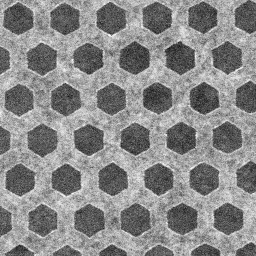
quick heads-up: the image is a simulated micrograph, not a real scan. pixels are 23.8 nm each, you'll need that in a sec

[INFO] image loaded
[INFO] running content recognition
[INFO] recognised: a regular array of raised bodies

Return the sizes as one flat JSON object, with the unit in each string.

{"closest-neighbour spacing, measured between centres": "45.9 px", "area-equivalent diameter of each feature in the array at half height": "760 nm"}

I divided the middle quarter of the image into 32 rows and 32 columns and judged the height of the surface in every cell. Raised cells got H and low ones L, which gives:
LLHHHHHHHHLLLLHHHHHHHLLLLHHHHHHH
LLLLHHHHHLLLLLLHHHHHLLLLLLLHHHHH
LLLLLHHLLLLLLLLLLHHLLLLLLLLLHHLL
LLLLLLLLLLLLLLLLLLLLLLLLLLLLLLLL
LLLLLLLLLLLLLLLLLLLLLLLLLLLLLLLL
HHLLLLLLLLHHHHLLLLLLLHHHHHLLLLLL
HHHLLLLLLHHHHHHLLLLLHHHHHHHLLLLH
HHHHLLLLHHHHHHHHLLLLHHHHHHHLLLLH
HHHHLLLLHHHHHHHHLLLLHHHHHHHLLLLH
HHHHLLLLHHHHHHHHLLLLHHHHHHHLLLLH
HHHHLLLLHHHHHHHHLLLLHHHHHHHLLLLH
HHHHLLLLLHHHHHHLLLLLLHHHHHLLLLLL
HHLLLLLLLLLHHLLLLLLLLLLHLLLLLLLL
LLLLLLLLLLLLLLLLLLLLLLLLLLLLLLLL
LLLLLLLLLLLLLLLLLLLLLLLLLLLLLHLL
LLLLLHHLLLLLLLLLHHHHLLLLLLLHHHHH
LLLHHHHHHLLLLLHHHHHHHLLLLLHHHHHH
LLHHHHHHHHLLLLHHHHHHHLLLLLHHHHHH
LLLHHHHHHHLLLLHHHHHHHLLLLLHHHHHH
LLLHHHHHHHLLLLHHHHHHHHLLLLHHHHHH
LLLHHHHHHHLLLLHHHHHHHHLLLLHHHHHH
LLLHHHHHHHLLLLLHHHHHHLLLLLLHHHHH
LLLLLHHHLLLLLLLLLHHLLLLLLLLLHHLL
LLLLLLLLLLLLLLLLLLLLLLLLLLLLLLLL
LLLLLLLLLLLLLLLLLLLLLLLLLLLLLLLL
HHLLLLLLLLHHHHLLLLLLLLHHHLLLLLLL
HHHLLLLLLHHHHHHLLLLLHHHHHHHLLLLL
HHHHLLLLLHHHHHHHLLLLHHHHHHHLLLLH
HHHHLLLLLHHHHHHHLLLLHHHHHHHLLLLH
HHHHLLLLLHHHHHHHLLLLHHHHHHHLLLLH
HHHHLLLLLHHHHHHHLLLLHHHHHHHLLLLH
HHHHLLLLLHHHHHHLLLLLLHHHHHHLLLLL